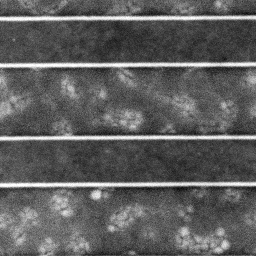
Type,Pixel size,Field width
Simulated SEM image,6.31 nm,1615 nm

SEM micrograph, one or a few lines or trenches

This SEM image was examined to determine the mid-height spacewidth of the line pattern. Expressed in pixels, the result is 72.8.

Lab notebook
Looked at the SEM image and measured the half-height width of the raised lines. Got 294 nm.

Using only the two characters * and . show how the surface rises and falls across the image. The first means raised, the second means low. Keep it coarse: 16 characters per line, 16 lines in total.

................
****************
****************
****************
................
................
................
................
................
****************
****************
*********.......
................
................
................
................